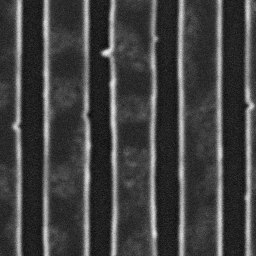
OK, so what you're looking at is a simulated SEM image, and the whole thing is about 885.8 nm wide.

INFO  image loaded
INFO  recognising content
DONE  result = one or a few lines or trenches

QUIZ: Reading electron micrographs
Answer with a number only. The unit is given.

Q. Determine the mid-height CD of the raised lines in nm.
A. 149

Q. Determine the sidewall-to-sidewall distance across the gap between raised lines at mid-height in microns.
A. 0.0845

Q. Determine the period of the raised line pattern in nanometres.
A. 232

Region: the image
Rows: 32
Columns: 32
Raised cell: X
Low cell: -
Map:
XXX---XXXXX---XXXXX----XXXXX---X
XXX---XXXXX---XXXXX---XXXXXX---X
XXX--XXXXXX---XXXXX---XXXXXX---X
XXX--XXXXXX---XXXXX---XXXXXX---X
XXX--XXXXXX---XXXXX---XXXXXX---X
XXX---XXXXX---XXXXX---XXXXXX---X
XXX---XXXXX--XXXXXX---XXXXXX---X
XX----XXXXX---XXXXX---XXXXXX---X
XX----XXXXX---XXXXX---XXXXXX---X
XX---XXXXXX---XXXXX---XXXXXX---X
XX----XXXXX---XXXXX---XXXXXX---X
XX----XXXXX---XXXXX---XXXXXX---X
XX----XXXXX---XXXXX---XXXXXX---X
XX----XXXXX---XXXXX---XXXXXX---X
XX----XXXXX---XXXXX---XXXXXX---X
XX----XXXXX---XXXXX----XXXXX---X
XX----XXXXX---XXXXX----XXXXX---X
XX----XXXXX---XXXXX----XXXXX---X
XX----XXXXX---XXXXX----XXXXX---X
XX----XXXXX---XXXXX----XXXXX---X
XX----XXXXX---XXXXX----XXXXX---X
XX----XXXXX---XXXXX----XXXXX---X
XX----XXXXX---XXXXX----XXXXX---X
XX----XXXXX---XXXXX----XXXXX---X
XX----XXXXX---XXXXX----XXXXX---X
XX----XXXXX---XXXXX----XXXXX---X
XX----XXXXX---XXXXX----XXXXX---X
XX----XXXXX---XXXXX----XXXXX---X
XX----XXXXX---XXXXX----XXXXX---X
XX----XXXXX---XXXXX----XXXXX---X
XX----XXXXX---XXXXX----XXXXX---X
XXX---XXXXX---XXXXX----XXXXX---X